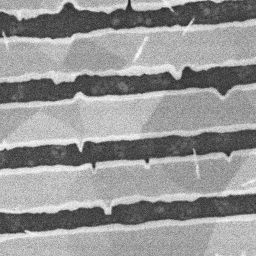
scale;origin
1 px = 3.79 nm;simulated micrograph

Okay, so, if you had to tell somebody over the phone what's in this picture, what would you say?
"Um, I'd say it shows one or a few lines or trenches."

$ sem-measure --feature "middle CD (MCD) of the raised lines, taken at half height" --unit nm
150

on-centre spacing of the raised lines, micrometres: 0.247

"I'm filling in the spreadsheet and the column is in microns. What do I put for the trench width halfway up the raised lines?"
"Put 0.094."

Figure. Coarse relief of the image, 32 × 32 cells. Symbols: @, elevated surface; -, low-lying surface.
@@@@@@@@-@@@@@@@@@@@@@----------
-@@@@-@-------------------------
--------------------------------
----------------------@@@-@@@@@@
---------@@@@@@@@@@@@@@@@@@@@@@@
@@@@@@@@@@@@@@@@@@@@@@@@@@@@@@@@
@@@@@@@@@@@@@@@@@@@@@@@@@@@@@@@@
@@@@@@@@@@@@@@@@@@@@@@@@@@@@@@@@
@@@@@@@@@@@@@@@@@@@@@@@---------
@@@@@@-@@-----------------------
--------------------------------
----------------------@@@@@--@@@
---------@@@@@@@@@@@@@@@@@@@@@@@
@@@@@@@@@@@@@@@@@@@@@@@@@@@@@@@@
@@@@@@@@@@@@@@@@@@@@@@@@@@@@@@@@
@@@@@@@@@@@@@@@@@@@@@@@@@@@@@@@@
@@@@@@@@@@@@@@@@@@@@@@@@@-------
@@@@@@@@@@@@@-------------------
--------------------------------
--------------------------@@-@@@
--------------@@@@@@@@@@@@@@@@@@
@@@@@@@@@@@@@@@@@@@@@@@@@@@@@@@@
@@@@@@@@@@@@@@@@@@@@@@@@@@@@@@@@
@@@@@@@@@@@@@@@@@@@@@@@@@@@@@@@@
@@@@@@@@@@@@@@@@@@@@@@@@@@@-----
@@@@@@@@@@@--@------------------
@@@-----------------------------
---------------------------@@@@@
-------------@@@@@@@@@@@@@@@@@@@
--@@@@@@@@@@@@@@@@@@@@@@@@@@@@@@
@@@@@@@@@@@@@@@@@@@@@@@@@@@@@@@@
@@@@@@@@@@@@@@@@@@@@@@@@@@@@@@@@